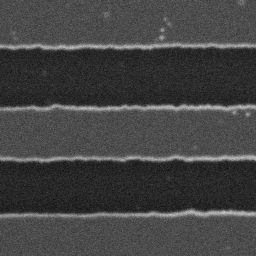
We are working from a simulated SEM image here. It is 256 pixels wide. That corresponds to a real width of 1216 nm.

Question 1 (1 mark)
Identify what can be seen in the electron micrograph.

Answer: lines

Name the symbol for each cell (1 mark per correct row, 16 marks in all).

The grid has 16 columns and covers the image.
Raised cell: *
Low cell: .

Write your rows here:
****************
****************
****************
................
................
................
................
****************
****************
****************
................
................
................
****************
****************
****************